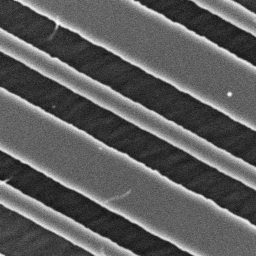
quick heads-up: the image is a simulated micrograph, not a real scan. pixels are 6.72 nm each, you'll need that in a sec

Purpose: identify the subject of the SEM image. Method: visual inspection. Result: lines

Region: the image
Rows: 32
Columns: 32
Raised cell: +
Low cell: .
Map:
...+++++++++++++++.......+++++..
.....++++++++++++++.......+++++.
.......++++++++++++++.......++++
........+++++++++++++++.......++
++........+++++++++++++++.......
++++........+++++++++++++++.....
+++++.........+++++++++++++++...
..+++++.........++++++++++++++..
....+++++.........++++++++++++++
......+++++........+++++++++++++
........+++++........+++++++++++
+........++++++........+++++++++
+++........+++++.........+++++++
+++++........+++++.........+++++
+++++++........+++++........++++
+++++++++........+++++........++
+++++++++++........+++++........
++++++++++++.........+++++......
++++++++++++++........+++++.....
.+++++++++++++++........+++++...
...+++++++++++++++........+++++.
.....+++++++++++++++........++++
.......++++++++++++++.........++
++.......++++++++++++++.........
+++........++++++++++++++.......
+++++.......+++++++++++++++.....
..+++++.......+++++++++++++++...
....+++++.......+++++++++++++++.
......+++++.......++++++++++++++
........+++++.......++++++++++++
.........++++++.......++++++++++
...........+++++.......+++++++++